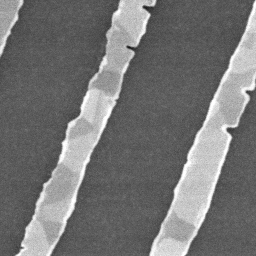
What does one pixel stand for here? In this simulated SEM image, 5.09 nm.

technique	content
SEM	one or a few lines or trenches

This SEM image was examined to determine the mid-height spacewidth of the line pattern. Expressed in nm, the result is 474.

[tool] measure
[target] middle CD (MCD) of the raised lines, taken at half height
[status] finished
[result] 0.154 microns